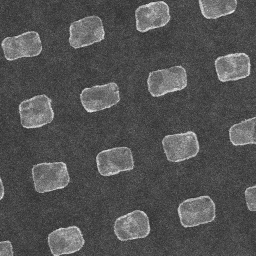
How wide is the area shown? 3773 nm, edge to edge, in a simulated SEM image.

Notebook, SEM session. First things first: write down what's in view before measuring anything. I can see a regular array of raised bodies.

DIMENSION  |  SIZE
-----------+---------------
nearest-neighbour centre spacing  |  974 nm